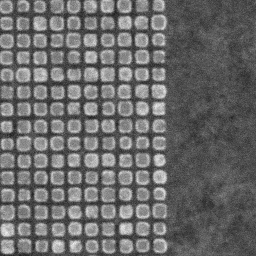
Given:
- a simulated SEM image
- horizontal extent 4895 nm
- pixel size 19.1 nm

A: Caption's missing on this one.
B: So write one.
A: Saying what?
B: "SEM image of a regular array of raised bodies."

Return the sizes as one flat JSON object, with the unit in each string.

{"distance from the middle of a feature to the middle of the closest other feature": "16.6 px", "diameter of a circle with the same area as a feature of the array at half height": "0.237 um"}